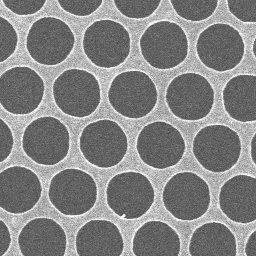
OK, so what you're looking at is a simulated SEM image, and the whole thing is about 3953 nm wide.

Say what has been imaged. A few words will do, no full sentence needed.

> a regular array of holes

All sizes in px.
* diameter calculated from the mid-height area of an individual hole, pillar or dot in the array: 48.1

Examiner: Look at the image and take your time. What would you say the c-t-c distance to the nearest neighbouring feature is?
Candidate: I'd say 873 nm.